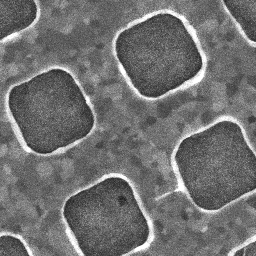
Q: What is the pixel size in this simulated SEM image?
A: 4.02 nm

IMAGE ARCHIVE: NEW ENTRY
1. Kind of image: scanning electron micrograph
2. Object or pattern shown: holes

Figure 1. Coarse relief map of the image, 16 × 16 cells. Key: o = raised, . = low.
..oooooooooooo..
..ooooooo...ooo.
ooooooo.....oooo
ooooooo......ooo
ooo.oooo.....ooo
o....ooo...ooooo
o....ooooooooooo
o.....oooooooooo
o....ooooooo...o
oo.oooooooo.....
ooooooooooo.....
oooooo..ooo.....
oooo.....ooo...o
oooo.....ooooooo
oooo.....ooooooo
..ooo....oooooo.